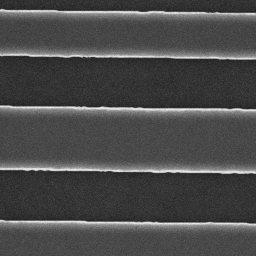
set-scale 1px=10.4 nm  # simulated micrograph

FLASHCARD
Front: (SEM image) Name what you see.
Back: lines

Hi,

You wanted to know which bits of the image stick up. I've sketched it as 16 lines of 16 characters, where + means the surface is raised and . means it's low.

................
++++++++++++++++
++++++++++++++++
.+++++++++++++++
................
................
................
++++++++++++++++
++++++++++++++++
++++++++++++++++
++++++++++++++++
................
................
................
++++++++++++++++
++++++++++++++++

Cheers